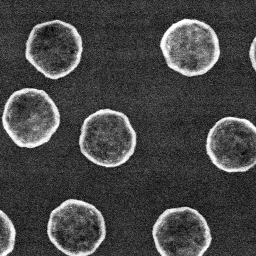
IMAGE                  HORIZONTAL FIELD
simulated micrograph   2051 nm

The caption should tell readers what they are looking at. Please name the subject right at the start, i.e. raised bodies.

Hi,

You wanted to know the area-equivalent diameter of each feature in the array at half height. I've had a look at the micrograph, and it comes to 433 nm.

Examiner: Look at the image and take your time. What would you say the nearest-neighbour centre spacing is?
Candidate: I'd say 76.4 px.